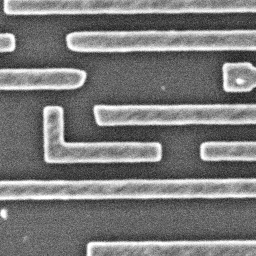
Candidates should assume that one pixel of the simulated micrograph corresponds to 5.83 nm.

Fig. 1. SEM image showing wiring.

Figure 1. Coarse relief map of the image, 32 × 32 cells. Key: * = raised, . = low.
.*******************************
.****************...............
................................
................................
*........***********************
**.......***********************
................................
................................
............................****
***********.................****
**********..................****
................................
................................
......*.....********************
......**....********************
......**.....**.................
......**........................
......**........................
......**************.....*******
......**************.....*******
................................
................................
................................
********************************
*******************************.
................................
................................
................................
................................
................................
...........*********************
...........*********************